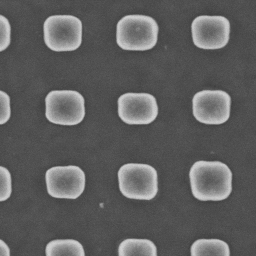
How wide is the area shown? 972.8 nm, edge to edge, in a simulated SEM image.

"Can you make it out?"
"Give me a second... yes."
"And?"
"a regular array of raised bodies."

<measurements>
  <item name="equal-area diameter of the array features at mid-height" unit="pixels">38.6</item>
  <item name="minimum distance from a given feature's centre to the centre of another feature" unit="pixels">73.3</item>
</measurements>